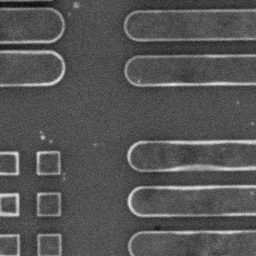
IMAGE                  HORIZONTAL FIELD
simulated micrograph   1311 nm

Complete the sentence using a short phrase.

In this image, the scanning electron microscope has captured groups of lines, slits or small figures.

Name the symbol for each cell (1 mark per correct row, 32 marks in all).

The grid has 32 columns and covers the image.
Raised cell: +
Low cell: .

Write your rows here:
................................
+++++++..........+++++++++++++++
++++++++........++++++++++++++++
++++++++........++++++++++++++++
++++++++........++++++++++++++++
................................
................................
++++++++........++++++++++++++++
++++++++........++++++++++++++++
++++++++........++++++++++++++++
++++++...........+++++++++......
................................
................................
................................
................................
................................
................................
................................
................++++++++++++++++
++...++.........++++++++++++++++
++...++.........++++++++++++++++
++...++.........................
................................
.................+++++++++++++++
++...++.........++++++++++++++++
++...++.........++++++++++++++++
++...++..........+++++++++++++++
................................
................................
++...++..........+++++++++++++++
++...+++........++++++++++++++++
++...+++........++++++++++++++++